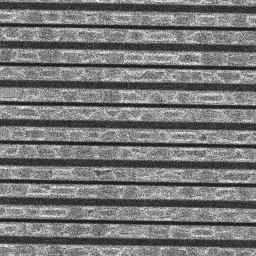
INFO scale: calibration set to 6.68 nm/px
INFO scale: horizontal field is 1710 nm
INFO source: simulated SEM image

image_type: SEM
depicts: parallel lines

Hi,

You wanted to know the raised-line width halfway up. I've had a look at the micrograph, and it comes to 96.9 nanometers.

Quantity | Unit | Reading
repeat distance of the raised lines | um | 0.129